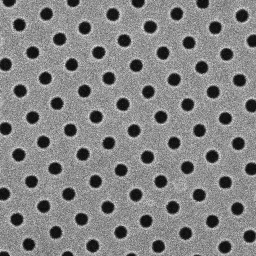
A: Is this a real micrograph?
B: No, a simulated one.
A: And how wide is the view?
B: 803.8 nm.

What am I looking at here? a regular array of holes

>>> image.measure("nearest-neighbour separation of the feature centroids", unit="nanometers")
87.5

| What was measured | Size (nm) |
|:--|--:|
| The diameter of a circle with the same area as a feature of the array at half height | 41.9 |